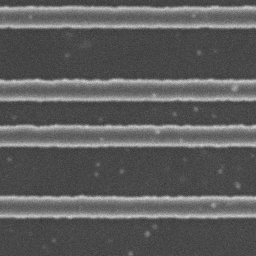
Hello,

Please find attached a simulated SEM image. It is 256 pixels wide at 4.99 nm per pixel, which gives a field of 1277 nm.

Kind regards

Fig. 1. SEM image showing lines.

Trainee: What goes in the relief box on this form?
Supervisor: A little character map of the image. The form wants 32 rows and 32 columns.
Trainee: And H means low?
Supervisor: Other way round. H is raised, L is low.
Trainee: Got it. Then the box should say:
LLLLLLLLLLLLLLLLLLLLLLLLLLLLLLLL
HHHHHHHHHHHHHHHHHHHHHHHHHHHHHHHH
HHHHHHHHHHHHHHHHHHHHHHHHHHHHHHHH
LLLLLLLLLLLLLLLLLLLLLLLLLLLLLLLL
LLLLLLLLLLLLLLLLLLLLLLLLLLLLLLLL
LLLLLLLLLLLLLLLLLLLLLLLLLLLLLLLL
LLLLLLLLLLLLLLLLLLLLLLLLLLLLLLLL
LLLLLLLLLLLLLLLLLLLLLLLLLLLLLLLL
LLLLLLLLLLLLLLLLLLLLLLLLLLLLLLLL
LLLLLLLLLLLLLLLLLLLLLLLLLLLLLLLL
HHHHHHHHHHHHHHHHHHHHHHHHHHHHHHHH
HHHHHHHHHHHHHHHHHHHHHHHHHHHHHHHH
HHHHHHHHHHHHHHHHHHHHHHHHHHHHHHHH
LLLLLLLLLLLLLLLLLLLLLLLLLLLLLLLL
LLLLLLLLLLLLLLLLLLLLLLLLLLLLLLLL
LLLLLLLLLLLLLLLLLLLLLLLLLLLLLLLL
HHHHHHHHHHHHHHHHHHHHHHHHHHHHHHHH
HHHHHHHHHHHHHHHHHHHHHHHHHHHHHHHH
LLLLLLLLLLLLLLLLLLLLLLLLLLLLLLLL
LLLLLLLLLLLLLLLLLLLLLLLLLLLLLLLL
LLLLLLLLLLLLLLLLLLLLLLLLLLLLLLLL
LLLLLLLLLLLLLLLLLLLLLLLLLLLLLLLL
LLLLLLLLLLLLLLLLLLLLLLLLLLLLLLLL
LLLLLLLLLLLLLLLLLLLLLLLLLLLLLLLL
LLLLLLLLLLLLLLLLLLLLLLLLLLLLLLLL
HHHHHHHHHHHHHHHHHHHHHHHHHHHHHHHH
HHHHHHHHHHHHHHHHHHHHHHHHHHHHHHHH
LLLLLLLLLLLLLLLLLLLLLLLLLLLLLLLL
LLLLLLLLLLLLLLLLLLLLLLLLLLLLLLLL
LLLLLLLLLLLLLLLLLLLLLLLLLLLLLLLL
LLLLLLLLLLLLLLLLLLLLLLLLLLLLLLLL
LLLLLLLLLLLLLLLLLLLLLLLLLLLLLLLL